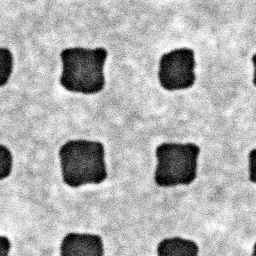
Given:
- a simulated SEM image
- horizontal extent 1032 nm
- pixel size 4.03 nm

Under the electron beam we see holes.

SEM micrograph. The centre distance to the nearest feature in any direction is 0.376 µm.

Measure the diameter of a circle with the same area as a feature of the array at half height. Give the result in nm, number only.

199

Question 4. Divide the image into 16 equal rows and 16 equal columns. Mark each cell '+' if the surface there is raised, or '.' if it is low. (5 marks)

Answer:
++++++++++++++++
++++++++++++++++
++++++++++++++++
.+++...+++..++++
.+++...+++..++++
++++..++++..++++
++++++++++++++++
++++++++++++++++
++++++++++++++++
.+++...+++..++++
.+++...+++..++++
++++..++++..++++
++++++++++++++++
++++++++++++++++
++++++++++++++++
.+++..++++..++++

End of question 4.